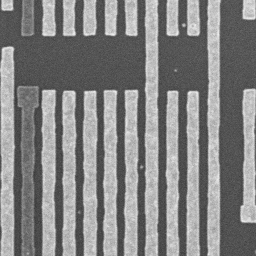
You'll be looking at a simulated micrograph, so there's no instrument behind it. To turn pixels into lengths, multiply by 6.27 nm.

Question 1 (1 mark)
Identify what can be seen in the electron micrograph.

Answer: wiring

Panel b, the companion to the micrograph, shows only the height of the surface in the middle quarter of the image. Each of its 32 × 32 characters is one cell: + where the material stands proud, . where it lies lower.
.....................++.........
.....................++.........
.....................++.........
.....................++.........
.....................++.........
.....................++.........
.....................++.........
+++..+++..+++..+++...++...++...+
+++..+++..+++..+++...++...++...+
+++..+++..+++..+++...++...++...+
+++..+++..+++...++...++...++...+
++...+++..+++...++...++...++...+
++...+++..+++...++...++...++...+
++...+++..+++...++...++...++...+
+++..+++..+++...++...++...++...+
+++..+++..+++..+++...++...++...+
+++..+++..+++..+++...++...++...+
+++..+++..+++..+++..+++...++...+
+++..+++..+++..+++..+++...++...+
+++..+++..+++..+++..+++...++...+
+++..+++..+++..+++..+++...++...+
++...+++..+++..+++...++...++...+
++...+++..+++..+++...++...++...+
+++..+++..+++..+++...++...++...+
+++..+++..+++..+++...++...++...+
+++..+++..+++...++...++...++...+
+++..+++..+++...++...++...++...+
+++..+++..+++...++...++...++...+
++...+++..+++...++...++...++...+
+++..+++..+++...++...++...++...+
+++..+++..+++...++...++...++...+
+++..+++..+++...++...++...++...+